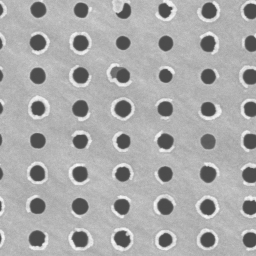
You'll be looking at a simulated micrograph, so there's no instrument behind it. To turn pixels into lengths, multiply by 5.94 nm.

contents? a regular array of holes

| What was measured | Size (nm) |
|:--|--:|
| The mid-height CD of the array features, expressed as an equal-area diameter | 86.9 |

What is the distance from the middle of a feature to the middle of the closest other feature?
193 nanometres